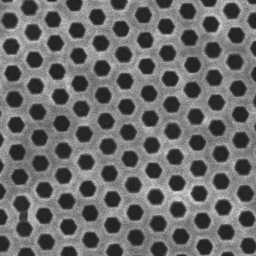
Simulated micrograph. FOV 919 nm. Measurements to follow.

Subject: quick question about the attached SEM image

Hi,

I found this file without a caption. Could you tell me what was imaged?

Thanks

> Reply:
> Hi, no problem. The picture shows a regular array of holes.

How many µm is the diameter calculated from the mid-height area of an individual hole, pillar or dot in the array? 0.056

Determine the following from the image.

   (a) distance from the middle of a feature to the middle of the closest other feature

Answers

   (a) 89.3 nm